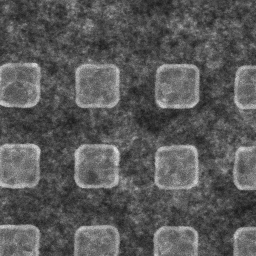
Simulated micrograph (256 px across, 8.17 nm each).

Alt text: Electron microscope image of raised bodies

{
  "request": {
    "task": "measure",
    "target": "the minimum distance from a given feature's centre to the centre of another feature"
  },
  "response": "651 nanometers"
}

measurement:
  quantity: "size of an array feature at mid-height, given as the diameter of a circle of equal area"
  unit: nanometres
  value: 368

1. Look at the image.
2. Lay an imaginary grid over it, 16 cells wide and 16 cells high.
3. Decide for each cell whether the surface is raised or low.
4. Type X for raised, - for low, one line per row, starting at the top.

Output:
----------------
----------------
----------------
----------------
XX---XX---XX---X
XX---XX---XX---X
XX---XX---XX---X
----------------
----------------
XX---XX---XX---X
XX---XX---XX---X
XX---XX---XX---X
----------------
----------------
XX---XX---XX---X
XX---XX---XX---X